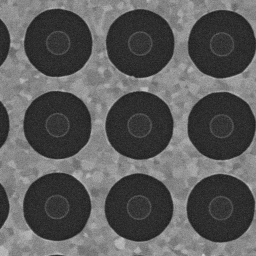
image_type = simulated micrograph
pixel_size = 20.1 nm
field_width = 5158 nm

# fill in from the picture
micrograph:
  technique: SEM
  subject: an array of small figures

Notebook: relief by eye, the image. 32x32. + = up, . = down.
++++++++++++++++++++++++++++++++
+++++....+++++++...+++++++...+++
++++......++++.......++++......+
.++........+++.......+++........
.++........++.........++........
.++.........+.........+.........
.++........++.........++........
.+++.......+++.......+++........
++++......+++++......++++......+
++++++..++++++++...+++++++...+++
++++++++++++++++++++++++++++++++
++++++..++++++++..+++++++++..+++
++++......+++++.....+++++.....++
.++........+++.......+++.......+
.++........++.........++........
.++........++.........+.........
.++........++.........+.........
.++........++........+++........
++++......++++.......+++.......+
+++++....+++++++....++++++....++
++++++++++++++++++++++++++++++++
++++++++++++++++++++++++++++++++
++++......+++++.....+++++.....++
.+++.......+++.......+++.......+
.++........++........+++........
.++........++.........+.........
.++........++.........+.........
.++........++........+++........
++++......++++.......+++.......+
+++++....++++++.....+++++.....++
++++++++++++++++++++++++++++++++
++++++++++++++++++++++++++++++++